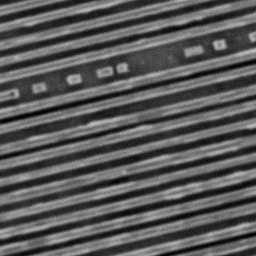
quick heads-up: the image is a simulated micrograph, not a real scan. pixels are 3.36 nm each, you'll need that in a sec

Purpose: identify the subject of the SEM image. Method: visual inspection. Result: parallel lines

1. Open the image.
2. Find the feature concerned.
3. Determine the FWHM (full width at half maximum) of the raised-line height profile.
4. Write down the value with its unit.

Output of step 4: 8.39 px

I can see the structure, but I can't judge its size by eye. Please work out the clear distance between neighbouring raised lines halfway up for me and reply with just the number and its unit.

0.0253 micrometres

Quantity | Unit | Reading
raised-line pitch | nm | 56.1